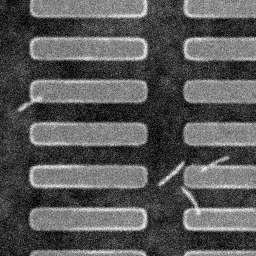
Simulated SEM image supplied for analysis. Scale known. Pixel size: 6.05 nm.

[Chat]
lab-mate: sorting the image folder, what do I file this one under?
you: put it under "groups of lines, slits or small figures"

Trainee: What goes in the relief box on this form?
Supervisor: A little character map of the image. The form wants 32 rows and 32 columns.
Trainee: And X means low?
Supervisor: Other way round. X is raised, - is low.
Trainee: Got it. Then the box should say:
----XXXXXXXXXXXXXX-----XXXXXXXXX
----XXXXXXXXXXXXXX-----XXXXXXXXX
--------------------------------
--------------------------------
--------------------------------
----XXXXXXXXXXXXXX-----XXXXXXXXX
----XXXXXXXXXXXXXX-----XXXXXXXXX
--------------------------------
--------------------------------
--------------------------------
----XXXXXXXXXXXXXX-----XXXXXXXXX
----XXXXXXXXXXXXXX-----XXXXXXXXX
----XXXXXXXXXXXXXX-----XXXXXXXXX
--------------------------------
--------------------------------
-----XXXXXXXXXXXXX------XXXXXXXX
----XXXXXXXXXXXXXX-----XXXXXXXXX
----XXXXXXXXXXXXXX-----XXXXXXXXX
--------------------------------
--------------------------------
--------------------------------
----XXXXXXXXXXXXXX-----XXXXXXXXX
----XXXXXXXXXXXXXX-----XXXXXXXXX
--------------------------------
--------------------------------
--------------------------------
----XXXXXXXXXXXXXX-----XXXXXXXXX
----XXXXXXXXXXXXXX-----XXXXXXXXX
----XXXXXXXXXXXXXX------XXXXXXXX
--------------------------------
--------------------------------
----XXXXXXXX-XXXXX-----------XXX